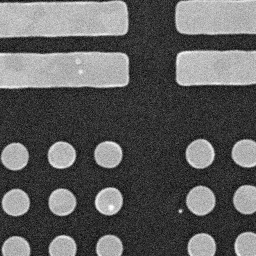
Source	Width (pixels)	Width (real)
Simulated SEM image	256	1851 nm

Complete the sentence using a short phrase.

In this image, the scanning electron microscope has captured groups of lines, slits or small figures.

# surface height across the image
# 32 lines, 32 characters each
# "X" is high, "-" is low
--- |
XXXXXXXXXXXXXXXX------XXXXXXXXXX
XXXXXXXXXXXXXXXX------XXXXXXXXXX
XXXXXXXXXXXXXXXX------XXXXXXXXXX
XXXXXXXXXXXXXXXX------XXXXXXXXXX
XX------------------------------
--------------------------------
-----------------------XXXXXXXXX
XXXXXXXXXXXXXXXX------XXXXXXXXXX
XXXXXXXXXXXXXXXX------XXXXXXXXXX
XXXXXXXXXXXXXXXX------XXXXXXXXXX
XXXXXXXXXXXXXXXX-------XXXXXXXX-
--------------------------------
--------------------------------
--------------------------------
--------------------------------
--------------------------------
--------------------------------
--------------------------------
-XX---XXX---XXX--------XXX---XXX
XXX---XXX---XXX--------XXXX--XXX
-XX---XXX---XXX---------XX----XX
--------------------------------
--------------------------------
------------------------XX----XX
-XX---XXX---XXX--------XXXX--XXX
XXXX--XXX---XXX--------XXXX--XXX
-XX----XX----XX---------XX----XX
--------------------------------
--------------------------------
-------------X----------XX----XX
-XX---XXX---XXX---------XXX--XXX
XXXX--XXX---XXX---------XXX---XX